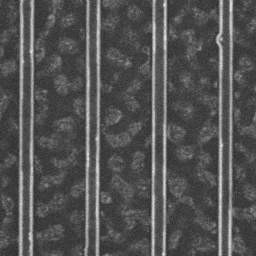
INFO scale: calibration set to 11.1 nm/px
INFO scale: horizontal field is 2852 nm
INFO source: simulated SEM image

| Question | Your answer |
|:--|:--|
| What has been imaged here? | one or a few lines or trenches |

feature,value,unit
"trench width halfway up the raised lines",606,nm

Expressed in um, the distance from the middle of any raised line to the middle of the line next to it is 0.739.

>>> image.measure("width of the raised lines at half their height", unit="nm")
125